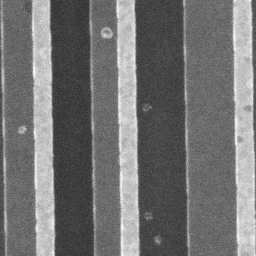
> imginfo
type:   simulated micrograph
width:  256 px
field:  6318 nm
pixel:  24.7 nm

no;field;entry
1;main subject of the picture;lines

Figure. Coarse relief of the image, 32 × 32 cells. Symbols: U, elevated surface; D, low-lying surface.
UUUUUUDDDDDUUUUUUDDDDDDUUUUUUUUD
UUUUUUDDDDDUUUUUUDDDDDDUUUUUUUUD
UUUUUUDDDDDUUUUUUDDDDDDUUUUUUUUD
UUUUUUDDDDDUUUUUUDDDDDDUUUUUUUUD
UUUUUUDDDDDUUUUUUDDDDDDUUUUUUUUD
UUUUUUDDDDDUUUUUUDDDDDDUUUUUUUUD
UUUUUUDDDDDUUUUUUDDDDDDUUUUUUUUD
UUUUUUDDDDDUUUUUUDDDDDDUUUUUUUUD
UUUUUUDDDDDUUUUUUDDDDDDUUUUUUUUU
UUUUUUDDDDDUUUUUUDDDDDDUUUUUUUUU
UUUUUUDDDDDDUUUUUDDDDDDUUUUUUUUU
UUUUUUDDDDDDUUUUUDDDDDDUUUUUUUUU
UUUUUUDDDDDDUUUUUDDDDDDUUUUUUUUU
UUUUUUDDDDDDUUUUUDDDDDDUUUUUUUUU
UUUUUUDDDDDDUUUUUDDDDDDUUUUUUUUU
UUUUUUUDDDDDUUUUUDDDDDDUUUUUUUUU
DUUUUUUDDDDDUUUUUDDDDDDUUUUUUUUU
DUUUUUUDDDDDUUUUUDDDDDDUUUUUUUUU
DUUUUUUDDDDDUUUUUDDDDDDUUUUUUUUU
DUUUUUUDDDDDUUUUUDDDDDDUUUUUUUUU
DUUUUUUDDDDDUUUUUDDDDDDUUUUUUUUU
DUUUUUUDDDDDUUUUUDDDDDDUUUUUUUUU
DUUUUUUDDDDDUUUUUDDDDDDUUUUUUUUU
DUUUUUUDDDDDUUUUUDDDDDDDUUUUUUUU
DUUUUUUDDDDDUUUUUDDDDDDDUUUUUUUU
DUUUUUUDDDDDUUUUUDDDDDDDUUUUUUUU
DUUUUUUDDDDDUUUUUDDDDDDDUUUUUUUU
DUUUUUUDDDDDUUUUUDDDDDDDUUUUUUUU
DUUUUUUDDDDDUUUUUDDDDDDDUUUUUUUU
DUUUUUUDDDDDUUUUUDDDDDDDUUUUUUUU
DUUUUUUDDDDDUUUUUDDDDDDDUUUUUUUU
DUUUUUUDDDDDUUUUUDDDDDDDUUUUUUUU